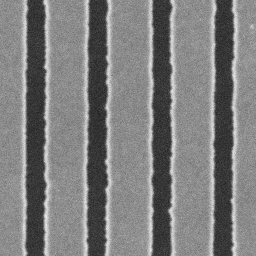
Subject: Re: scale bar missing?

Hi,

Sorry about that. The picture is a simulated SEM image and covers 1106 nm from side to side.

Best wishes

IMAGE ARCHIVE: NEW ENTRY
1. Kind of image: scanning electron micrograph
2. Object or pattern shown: lines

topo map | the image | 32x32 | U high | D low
UUUDDDUUUUUDDDUUUUUDDUUUUUUDDUUU
UUUDDDUUUUUDDUUUUUUDDUUUUUUDDUUU
UUUDDDUUUUUDDUUUUUUDDUUUUUUDDUUU
UUUDDDUUUUUDDUUUUUUDDUUUUUUDDUUU
UUUDDDUUUUUDDUUUUUUDDUUUUUUDDUUU
UUUDDDUUUUUDDUUUUUUDDUUUUUUDDUUU
UUUDDDUUUUUDDUUUUUUDDUUUUUUDDUUU
UUUDDDUUUUUDDUUUUUUDDUUUUUUDDUUU
UUUDDDUUUUUDDUUUUUUDDDUUUUUDDUUU
UUUDDDUUUUUDDUUUUUUDDUUUUUUDDUUU
UUUDDDUUUUUDDUUUUUUDDUUUUUUDDUUU
UUUDDDUUUUUDDDUUUUUDDUUUUUUDDUUU
UUUDDDUUUUUDDUUUUUUDDDUUUUUDDUUU
UUUDDDUUUUUDDUUUUUUDDUUUUUUDDUUU
UUUDDDUUUUUDDUUUUUUDDUUUUUUDDUUU
UUUDDDUUUUUDDUUUUUUDDUUUUUUDDUUU
UUUDDDUUUUUDDUUUUUUDDDUUUUUDDUUU
UUUDDDUUUUUDDUUUUUUDDDUUUUUDDUUU
UUUDDDUUUUUDDUUUUUUDDUUUUUUDDUUU
UUUDDDUUUUUDDUUUUUUDDUUUUUUDDUUU
UUUDDDUUUUUDDUUUUUUDDUUUUUUDDUUU
UUUDDDUUUUUDDUUUUUUDDUUUUUUDDUUU
UUUDDDUUUUUDDDUUUUUDDDUUUUUDDUUU
UUUDDDUUUUUDDUUUUUUDDUUUUUUDDUUU
UUUDDDUUUUUDDUUUUUUDDDUUUUUDDUUU
UUUDDDUUUUUDDUUUUUUDDUUUUUUDDUUU
UUUDDDUUUUUDDUUUUUUDDUUUUUUDDUUU
UUUDDDUUUUUDDUUUUUUDDUUUUUUDDUUU
UUUDDDUUUUUDDUUUUUUDDUUUUUUDDUUU
UUUDDDUUUUUDDUUUUUUDDUUUUUUDDUUU
UUUDDDUUUUUDDUUUUUUDDUUUUUUDDUUU
UUUDDDUUUUUDDUUUUUUDDUUUUUUDDUUU